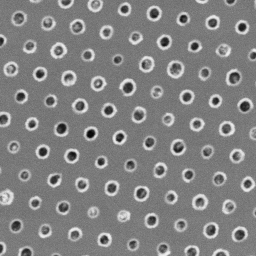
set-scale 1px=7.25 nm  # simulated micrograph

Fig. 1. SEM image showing a regular array of holes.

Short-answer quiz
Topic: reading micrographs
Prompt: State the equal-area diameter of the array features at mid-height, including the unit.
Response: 68.4 nanometres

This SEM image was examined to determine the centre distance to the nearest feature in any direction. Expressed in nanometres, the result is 211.